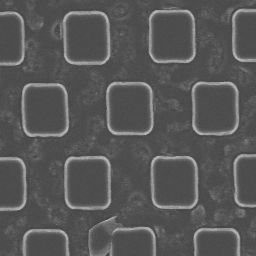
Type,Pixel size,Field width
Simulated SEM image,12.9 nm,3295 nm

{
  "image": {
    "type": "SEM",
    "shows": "raised bodies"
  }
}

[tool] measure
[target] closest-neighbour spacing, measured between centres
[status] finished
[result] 1.08 um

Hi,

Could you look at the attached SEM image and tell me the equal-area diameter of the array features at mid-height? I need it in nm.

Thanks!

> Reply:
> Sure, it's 680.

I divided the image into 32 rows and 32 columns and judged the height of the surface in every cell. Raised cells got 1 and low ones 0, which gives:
00000000000000000000000000000000
00000000000000000001111000000011
11100000111110000001111100000111
11100000111111000001111100000111
11100000111111000001111100000111
11100000111111000001111100000111
11100000111111000001111100000111
11100000111110000001111100000011
00000000000000000000000000000000
00000000000000000000000000000000
00000000000000111100000001111000
00011111000001111110000011111100
00011111000001111110000011111100
00011111000001111110000011111100
00011111000001111110000011111100
00011111000000111110000011111100
00011111000000111100000001111000
00000000000000000000000000000000
00000000000000000000000000000000
00000000000000000000000000000011
11100000111111000001111100000111
11100000111111000001111110000111
11100000111111000001111110000111
11100000111111000001111110000111
11100000111111000001111110000111
11100000111111000001111100000011
00000000000000000000000000000000
00000000000000000000000000000000
00000000000011000100000000000000
00011111000111111110000011111100
00011111000111111110000011111100
00011111100111111110000011111100